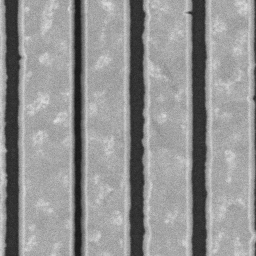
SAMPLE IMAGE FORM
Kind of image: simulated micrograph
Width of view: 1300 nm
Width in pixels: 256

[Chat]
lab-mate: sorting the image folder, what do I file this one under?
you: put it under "one or a few lines or trenches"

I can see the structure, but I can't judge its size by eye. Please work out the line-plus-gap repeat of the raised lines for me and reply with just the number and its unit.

0.31 um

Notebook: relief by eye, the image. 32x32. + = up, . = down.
...++++++..+++++..++++++..+++++.
...++++++..+++++..+++++...+++++.
...++++++..+++++..++++++..+++++.
...++++++..+++++..+++++...+++++.
...++++++..+++++..++++++..+++++.
...++++++..+++++..++++++..+++++.
...++++++..+++++..++++++..+++++.
...++++++..+++++..++++++..+++++.
...++++++..+++++..++++++..+++++.
...++++++..+++++..++++++..+++++.
...++++++..+++++..++++++..+++++.
...++++++..+++++..++++++..+++++.
...++++++..+++++..++++++..+++++.
...++++++..+++++..++++++..+++++.
...++++++..+++++..++++++..+++++.
...++++++..+++++..++++++..+++++.
...++++++..+++++..++++++..+++++.
...++++++..+++++..++++++..+++++.
...++++++..+++++..++++++..+++++.
...++++++..+++++..++++++..+++++.
...++++++..+++++..++++++..+++++.
...++++++..+++++...+++++..+++++.
+..++++++..+++++..++++++..+++++.
...++++++..+++++...+++++..+++++.
...++++++..+++++..++++++..+++++.
...++++++..+++++..++++++..+++++.
...++++++..+++++..++++++..+++++.
...++++++..+++++..++++++..+++++.
...++++++..+++++...+++++..++++++
...++++++..+++++...+++++..++++++
...++++++..+++++..++++++..++++++
...++++++..+++++..++++++..++++++